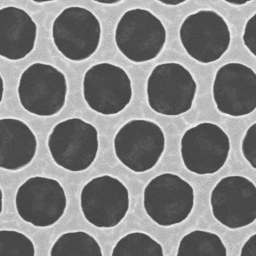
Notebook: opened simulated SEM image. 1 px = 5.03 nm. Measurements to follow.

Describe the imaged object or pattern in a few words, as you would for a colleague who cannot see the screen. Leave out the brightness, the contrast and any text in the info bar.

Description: a regular array of holes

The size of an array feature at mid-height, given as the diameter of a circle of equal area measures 255 nm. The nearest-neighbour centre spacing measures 0.316 microns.